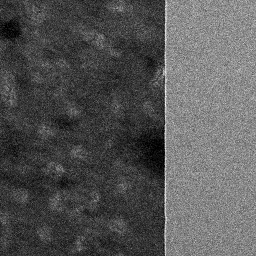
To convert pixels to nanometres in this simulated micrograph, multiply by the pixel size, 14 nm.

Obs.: one or a few lines or trenches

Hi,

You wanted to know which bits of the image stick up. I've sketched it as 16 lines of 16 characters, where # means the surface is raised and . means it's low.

..........######
..........######
..........######
..........######
..........######
..........######
..........######
..........######
..........######
..........######
..........######
..........######
..........######
..........######
..........######
..........######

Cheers